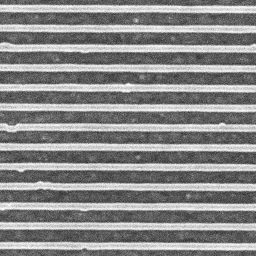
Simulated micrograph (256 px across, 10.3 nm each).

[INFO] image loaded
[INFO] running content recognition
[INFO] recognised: parallel lines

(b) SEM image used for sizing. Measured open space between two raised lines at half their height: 147 nm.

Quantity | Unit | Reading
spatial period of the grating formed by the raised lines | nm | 204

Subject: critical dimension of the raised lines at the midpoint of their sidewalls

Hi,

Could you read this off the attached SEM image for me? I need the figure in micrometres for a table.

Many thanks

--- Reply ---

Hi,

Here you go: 0.0554